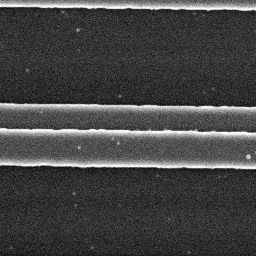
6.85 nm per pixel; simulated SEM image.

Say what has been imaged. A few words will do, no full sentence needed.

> lines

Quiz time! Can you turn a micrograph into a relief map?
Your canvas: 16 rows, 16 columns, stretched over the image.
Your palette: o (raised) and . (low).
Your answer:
......oooooooooo
................
................
................
................
................
o...............
oooooooooooooooo
oooooooooooooooo
oooooooooooooooo
...............o
................
................
................
................
................